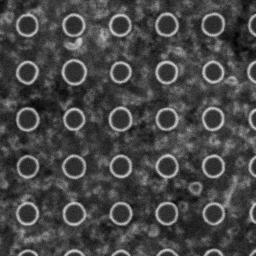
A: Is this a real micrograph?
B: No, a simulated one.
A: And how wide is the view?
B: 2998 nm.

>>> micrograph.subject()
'a regular array of raised bodies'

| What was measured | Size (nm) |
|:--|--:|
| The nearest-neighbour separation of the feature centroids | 542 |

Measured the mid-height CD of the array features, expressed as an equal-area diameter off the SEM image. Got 250 nanometres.